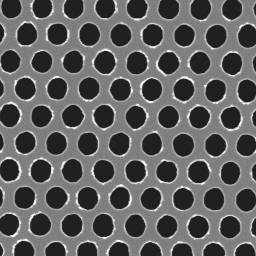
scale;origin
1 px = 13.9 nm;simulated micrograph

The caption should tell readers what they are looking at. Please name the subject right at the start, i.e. a regular array of holes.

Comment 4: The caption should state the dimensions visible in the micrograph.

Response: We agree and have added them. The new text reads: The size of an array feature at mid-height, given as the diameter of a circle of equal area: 298 nm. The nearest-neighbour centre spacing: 434 nm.